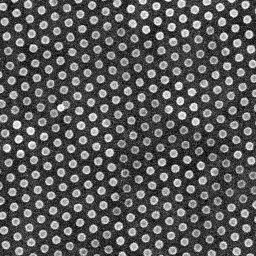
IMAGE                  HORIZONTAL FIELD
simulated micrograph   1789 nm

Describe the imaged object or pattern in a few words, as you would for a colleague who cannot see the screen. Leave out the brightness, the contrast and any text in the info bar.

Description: a regular array of raised bodies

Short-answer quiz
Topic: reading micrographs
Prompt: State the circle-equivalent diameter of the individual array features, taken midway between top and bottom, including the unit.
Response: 51.7 nm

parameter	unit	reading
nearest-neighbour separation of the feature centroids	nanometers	101